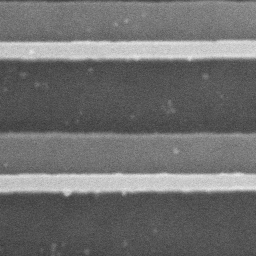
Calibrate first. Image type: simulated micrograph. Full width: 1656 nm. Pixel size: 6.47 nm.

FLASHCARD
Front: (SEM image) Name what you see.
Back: lines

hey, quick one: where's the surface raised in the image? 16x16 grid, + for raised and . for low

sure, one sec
++++++++++++++++
++++++++++++++++
++++++++++++++++
++++++++++++++++
................
................
................
................
++++++++.+++++++
++++++++++++++++
++++++++++++++++
++++++++++++++++
................
................
................
................